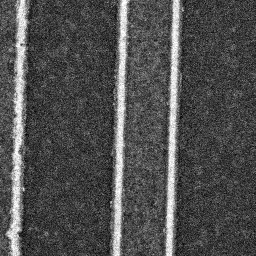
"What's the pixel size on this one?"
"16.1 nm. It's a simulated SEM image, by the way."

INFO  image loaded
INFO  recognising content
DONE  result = one or a few lines or trenches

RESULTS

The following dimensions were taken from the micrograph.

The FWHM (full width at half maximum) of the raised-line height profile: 840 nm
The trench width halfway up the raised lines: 1640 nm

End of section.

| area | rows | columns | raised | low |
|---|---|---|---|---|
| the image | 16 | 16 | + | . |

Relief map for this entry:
+.......+++.....
+.......+++.....
+.......+++.....
+.......+++.....
+.......+++.....
+.......+++.....
+.......+++.....
+.......+++.....
+.......+++.....
+......++++.....
+......++++.....
+......++++.....
+......++++.....
+......++++.....
+......++++.....
+......++++.....